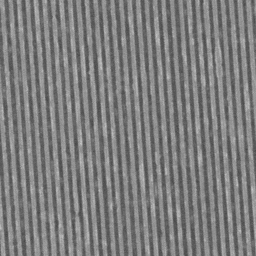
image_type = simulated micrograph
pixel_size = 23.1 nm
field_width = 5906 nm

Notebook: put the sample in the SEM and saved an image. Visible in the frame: parallel lines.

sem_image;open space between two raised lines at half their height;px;4.74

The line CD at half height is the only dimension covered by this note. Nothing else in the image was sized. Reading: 89.1 nanometers